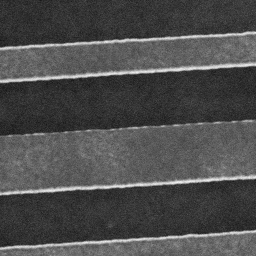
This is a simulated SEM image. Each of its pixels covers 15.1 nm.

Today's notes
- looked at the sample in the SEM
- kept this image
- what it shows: lines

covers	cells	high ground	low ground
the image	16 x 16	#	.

................
................
........########
################
##########......
................
................
................
################
################
################
##########......
................
................
...............#
################